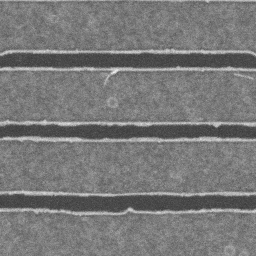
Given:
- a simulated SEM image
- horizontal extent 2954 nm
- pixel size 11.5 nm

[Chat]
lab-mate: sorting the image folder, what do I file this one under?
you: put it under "one or a few lines or trenches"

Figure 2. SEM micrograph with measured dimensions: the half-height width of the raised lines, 214 nm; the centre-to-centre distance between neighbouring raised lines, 821 nm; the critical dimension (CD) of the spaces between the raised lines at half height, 614 nm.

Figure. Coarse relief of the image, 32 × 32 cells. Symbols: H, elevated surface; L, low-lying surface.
LLLLLLLLLLLLLLLLLLLLLLLLLLLLLLLL
LLLLLLLLLLLLLLLLLLLLLLLLLLLLLLLL
LLLLLLLLLLLLLLLLLLLLLLLLLLLLLLLL
LLLLLLLLLLLLLLLLLLLLLLLLLLLLLLLL
LLLLLLLLLLLLLLLLLLLLLLLLLLLLLLLL
LLLLLLLLLLLLLLLLLLLLLLLLLLLLLLLL
LHHHHHHHHHHHHHHHHHHHHHHHHHHHHHHL
HHHHHHHHHHHHHHHHHHHHHHHHHHHHHHHH
HHHHHHHHHHHHHHHHHHHHHHHHHHHHHHHH
LLLLLLLLLLLLLLLLLLLLLLLLLLLLLLLL
LLLLLLLLLLLLLLLLLLLLLLLLLLLLLLLL
LLLLLLLLLLLLLLLLLLLLLLLLLLLLLLLL
LLLLLLLLLLLLLLLLLLLLLLLLLLLLLLLL
LLLLLLLLLLLLLLLLLLLLLLLLLLLLLLLL
LLLLLLLLLLLLLLLLLLLLLLLLLLLLLLLL
HHHHHHHHHHHHHHHHHHHHHHHHHHHHHHHH
HHHHHHHHHHHHHHHHHHHHHHHHHHHHHHHH
LLHLHHHHHHHHHHHHHHHHHHHHLHHHHHLL
LLLLLLLLLLLLLLLLLLLLLLLLLLLLLLLL
LLLLLLLLLLLLLLLLLLLLLLLLLLLLLLLL
LLLLLLLLLLLLLLLLLLLLLLLLLLLLLLLL
LLLLLLLLLLLLLLLLLLLLLLLLLLLLLLLL
LLLLLLLLLLLLLLLLLLLLLLLLLLLLLLLL
LLLLLLLLLLLLLLLLLLLLLLLLLLLLLLLL
HHHHHHHHHHHHHHHHHHHHHHHHHHHHHHHH
HHHHHHHHHHHHHHHHHHHHHHHHHHHHHHHH
LLLLLLLLHHHHHHHHLHHHHHHLLLLLLHHH
LLLLLLLLLLLLLLLLLLLLLLLLLLLLLLLL
LLLLLLLLLLLLLLLLLLLLLLLLLLLLLLLL
LLLLLLLLLLLLLLLLLLLLLLLLLLLLLLLL
LLLLLLLLLLLLLLLLLLLLLLLLLLLLLLLL
LLLLLLLLLLLLLLLLLLLLLLLLLLLLLLLL